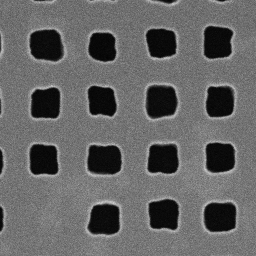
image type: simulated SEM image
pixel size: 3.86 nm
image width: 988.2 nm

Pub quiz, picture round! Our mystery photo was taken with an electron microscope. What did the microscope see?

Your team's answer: a regular array of holes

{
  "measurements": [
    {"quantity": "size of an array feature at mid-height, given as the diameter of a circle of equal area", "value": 123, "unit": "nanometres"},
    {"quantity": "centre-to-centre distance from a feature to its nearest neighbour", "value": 216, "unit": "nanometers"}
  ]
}